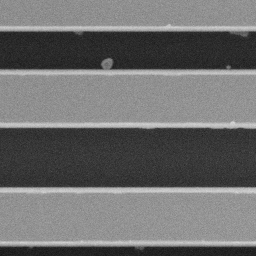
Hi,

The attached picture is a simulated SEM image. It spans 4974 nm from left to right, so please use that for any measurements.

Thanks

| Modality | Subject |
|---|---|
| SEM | lines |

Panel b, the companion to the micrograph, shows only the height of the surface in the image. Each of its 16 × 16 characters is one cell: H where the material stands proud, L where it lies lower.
HHHHHHHHHHHHHHHH
HHHHHHHHHHHHHHHH
LLLLLLLLLLLLLLLL
LLLLLLLLLLLLLLLL
HHHHHHHHHHHHHHHH
HHHHHHHHHHHHHHHH
HHHHHHHHHHHHHHHH
HHHHHHHHHHHHHHHH
LLLLLLLLLLLLLLLL
LLLLLLLLLLLLLLLL
LLLLLLLLLLLLLLLL
LLLLLLLLLLLLLLLL
HHHHHHHHHHHHHHHH
HHHHHHHHHHHHHHHH
HHHHHHHHHHHHHHHH
LLLLLLLLLLLLLLLL